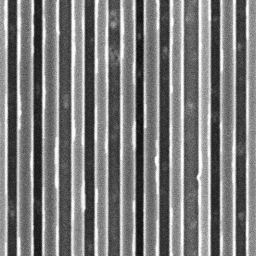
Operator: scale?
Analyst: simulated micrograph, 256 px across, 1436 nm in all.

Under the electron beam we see parallel lines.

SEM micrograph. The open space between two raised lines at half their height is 61.7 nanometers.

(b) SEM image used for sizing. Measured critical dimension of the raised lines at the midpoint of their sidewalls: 80.6 nm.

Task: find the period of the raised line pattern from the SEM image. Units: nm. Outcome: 142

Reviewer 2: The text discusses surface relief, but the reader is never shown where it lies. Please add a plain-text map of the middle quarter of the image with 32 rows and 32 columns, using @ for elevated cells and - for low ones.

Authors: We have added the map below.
--@@@---@@@---@@@@--@@@@---@@@--
--@@@---@@@---@@@@--@@@@---@@@--
--@@@---@@@---@@@@--@@@@---@@@--
--@@@---@@@---@@@@--@@@@---@@@--
--@@@---@@@---@@@@--@@@@---@@@--
--@@@---@@@---@@@@--@@@@---@@@--
--@@@---@@@---@@@@--@@@@---@@@--
--@@@---@@@---@@@@--@@@@---@@@--
--@@@---@@@---@@@@--@@@@---@@@--
--@@@---@@@---@@@@--@@@@---@@@--
--@@@---@@@---@@@@--@@@@---@@@--
--@@@---@@@---@@@@--@@@@---@@@--
--@@@---@@@---@@@@--@@@@---@@@--
--@@@---@@@---@@@@--@@@@---@@@--
--@@@---@@@---@@@@--@@@@---@@@--
--@@@---@@@---@@@@--@@@@---@@@--
--@@@---@@@---@@@@--@@@@---@@@--
--@@@---@@@---@@@@--@@@@---@@---
--@@@---@@@---@@@@--@@@@---@@@--
--@@@---@@@---@@@@--@@@@---@@@--
--@@@---@@@---@@@@--@@@@---@@---
--@@@---@@@---@@@@--@@@@---@@@--
--@@@---@@@---@@@@--@@@@---@@@--
--@@@---@@@---@@@@--@@@@---@@@--
--@@@---@@@---@@@@--@@@@---@@@--
--@@@---@@@---@@@@--@@@@---@@@--
--@@@---@@@---@@@@--@@@@---@@@--
--@@@---@@@---@@@@--@@@@---@@@--
--@@@---@@@---@@@@--@@@@---@@@--
--@@@---@@@---@@@@--@@@@---@@---
--@@@---@@@---@@@@--@@@@---@@---
--@@@---@@@---@@@@--@@@@---@@---